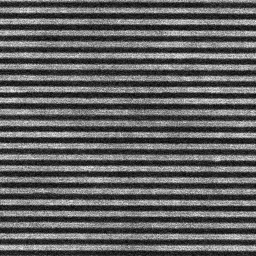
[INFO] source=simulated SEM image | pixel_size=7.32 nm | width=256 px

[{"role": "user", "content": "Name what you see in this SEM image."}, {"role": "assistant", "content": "parallel lines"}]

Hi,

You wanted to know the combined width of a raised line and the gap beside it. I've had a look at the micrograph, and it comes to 82.7 nm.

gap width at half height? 49.4 nanometers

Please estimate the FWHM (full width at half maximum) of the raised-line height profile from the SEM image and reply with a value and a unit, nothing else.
35.7 nm